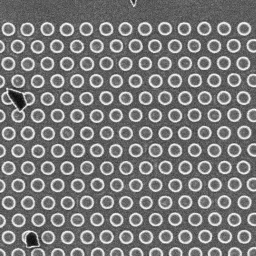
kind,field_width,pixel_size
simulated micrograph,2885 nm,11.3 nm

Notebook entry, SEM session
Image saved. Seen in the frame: a regular array of raised bodies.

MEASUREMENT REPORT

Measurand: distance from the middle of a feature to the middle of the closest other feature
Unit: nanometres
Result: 218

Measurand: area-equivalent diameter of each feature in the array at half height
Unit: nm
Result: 140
